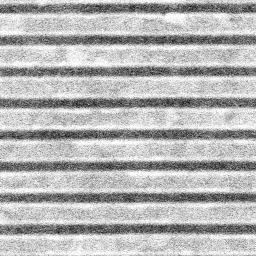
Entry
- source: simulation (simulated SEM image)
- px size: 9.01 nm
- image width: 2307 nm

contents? parallel lines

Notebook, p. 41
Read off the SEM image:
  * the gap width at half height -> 12.1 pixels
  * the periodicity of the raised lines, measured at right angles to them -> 0.284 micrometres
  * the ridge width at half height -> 174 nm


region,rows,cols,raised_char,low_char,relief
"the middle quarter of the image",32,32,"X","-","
--------------------------------
--------------------------------
--------------------------------
XXXXXXXX---XXX------------------
XXXXXXXXXXXXXXXXXXXXXXXXXXXXXXXX
XXXXXXXXXXXXXXXXXXXXXXXXXXXXXXXX
XXXXXXXXXXXXXXXXXXXXXXXXXXXXXXXX
XXXXXXXXXXXXXXXXXXXXXXXXXXXXXXXX
--------------------------------
--------------------------------
--------------------------------
-------XXX-XXXXXXXXXXXXXXXXX----
XXXXXXXXXXXXXXXXXXXXXXXXXXXXXXXX
XXXXXXXXXXXXXXXXXXXXXXXXXXXXXXXX
XXXXXXXXXXXXXXXXXXXXXXXXXXXXXXXX
XXXXXXXXXXXXXXXXXXXXXXXXXXXXXXXX
--------------------------------
--------------------------------
--------------------------------
XXXXXXXXXXXXXXXXXXXXXXXXXXXXXXXX
XXXXXXXXXXXXXXXXXXXXXXXXXXXXXXXX
XXXXXXXXXXXXXXXXXXXXXXXXXXXXXXXX
XXXXXXXXXXXXXXXXXXXXXXXXXXXXXXXX
XXXXXXXXXXXXXXXXXXXXXXXXXXXXXXXX
--------------------------------
--------------------------------
--------------------------------
XXXXXXXXXXXXXXXXXXXXXXXXXXXXXXXX
XXXXXXXXXXXXXXXXXXXXXXXXXXXXXXXX
XXXXXXXXXXXXXXXXXXXXXXXXXXXXXXXX
XXXXXXXXXXXXXXXXXXXXXXXXXXXXXXXX
XXXXXXXXXXXXXXXXXXXXXXXXXXXXXXXX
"